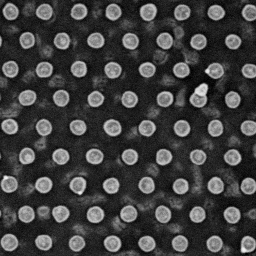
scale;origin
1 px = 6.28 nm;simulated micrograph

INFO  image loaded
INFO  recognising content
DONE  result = a regular array of raised bodies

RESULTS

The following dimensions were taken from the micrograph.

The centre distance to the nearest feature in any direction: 207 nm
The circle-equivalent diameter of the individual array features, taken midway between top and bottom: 0.0994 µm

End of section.